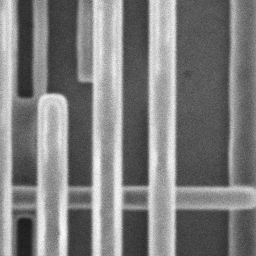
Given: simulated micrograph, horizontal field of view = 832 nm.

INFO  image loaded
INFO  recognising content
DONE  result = wiring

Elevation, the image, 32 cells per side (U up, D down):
UDDDDDDDDDDDUUUDDDDUUUDDDDDDDDDD
UDDDDDDDDDDDUUUDDDDUUUDDDDDDDDDD
UDDDDDDDDDDDUUUDDDDUUUDDDDDDDDDD
UDDDDDDDDDDDUUUDDDDUUUDDDDDDDDDD
UDDDDDDDDDDDUUUDDDDUUUDDDDDDDDDD
UDDDDDDDDDDDUUUDDDDUUUDDDDDDDDDD
UDDDDDDDDDDDUUUDDDDUUUDDDDDDDDDD
UDDDDDDDDDDDUUUDDDDUUUDDDDDDDDDD
UDDDDDDDDDDDUUUDDDDUUUDDDDDDDDDD
UDDDDDDDDDDDUUUDDDDUUUDDDDDDDDDD
UDDDDDDDDDDDUUUDDDDUUUDDDDDDDDDD
UDDDDDDDDDDDUUUDDDDUUUDDDDDDDDDD
UDDDDUUUDDDDUUUDDDDUUUDDDDDDDDDD
UDDDDUUUDDDDUUUDDDDUUUDDDDDDDDDD
UDDDDUUUDDDDUUUDDDDUUUDDDDDDDDDD
UDDDDUUUDDDDUUUDDDDUUUDDDDDDDDDD
UDDDDUUUDDDDUUUDDDDUUUDDDDDDDDDD
UDDDDUUUDDDDUUUDDDDUUUDDDDDDDDDD
UDDDDUUUDDDDUUUDDDDUUUDDDDDDDDDD
UDDDDUUUDDDDUUUDDDDUUUDDDDDDDDDD
UDDDDUUUDDDDUUUDDDDUUUDDDDDDDDDD
UDDDDUUUDDDDUUUDDDDUUUDDDDDDDDDD
UDDDDUUUDDDDUUUDDDDUUUDDDDDDDDDD
UDDDDUUUDDDDUUUDDDDUUUDDDDDDDDDD
UDDDDUUUDDDDUUUDDDDUUUDDDDDDDDDD
UDDDDUUUDDDDUUUDDDDUUUDDDDDDDDDD
UDDDDUUUDDDDUUUDDDDUUUDDDDDDDDDD
UDDDDUUUDDDDUUUDDDDUUUDDDDDDDDDD
UDDDDUUUDDDDUUUDDDDUUUDDDDDDDDDD
UDDDDUUUDDDDUUUDDDDUUUDDDDDDDDDD
UDDDDUUUDDDDUUUDDDDUUUDDDDDDDDDD
UDDDDUUUDDDDUUUDDDDUUUDDDDDDDDDD